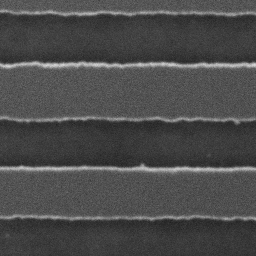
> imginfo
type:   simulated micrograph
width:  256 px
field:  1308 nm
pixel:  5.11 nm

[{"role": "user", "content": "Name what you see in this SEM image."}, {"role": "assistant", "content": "lines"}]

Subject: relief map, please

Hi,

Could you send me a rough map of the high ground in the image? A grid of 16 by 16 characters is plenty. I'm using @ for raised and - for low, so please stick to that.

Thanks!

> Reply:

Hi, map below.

@@@@@@@@@@@@@@@@
----------------
----------------
----------------
@@@@@@@@@@@@@@@@
@@@@@@@@@@@@@@@@
@@@@@@@@@@@@@@@@
-@@@---@@-@@@@@@
----------------
----------------
@@@@@@@@@@-@---@
@@@@@@@@@@@@@@@@
@@@@@@@@@@@@@@@@
@@@@@@@@@@@@@@@@
----------------
----------------